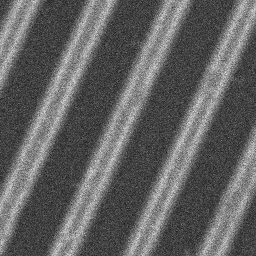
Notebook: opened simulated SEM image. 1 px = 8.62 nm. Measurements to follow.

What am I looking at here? one or a few lines or trenches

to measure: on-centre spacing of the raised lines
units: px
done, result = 68.1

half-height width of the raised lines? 180 nm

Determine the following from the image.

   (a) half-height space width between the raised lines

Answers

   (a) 47.1 pixels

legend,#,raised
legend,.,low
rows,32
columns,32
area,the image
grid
..###......###.......##.......##
.###.......###......###.......##
.###......###.......##.......###
###.......###......###.......##.
###......###.......##.......###.
##.......###......###.......##..
##......###.......###......###..
#.......###......###.......##...
#......###.......###......###...
#......###......###.......###...
.......##.......###......###....
......###.......##.......###....
......###......###.......##.....
.....###.......###......###.....
.....###......###.......##......
....###.......##.......###......
....###......###.......##.......
...###.......###......###.......
...###......###.......###......#
..####......###......###.......#
..###.......##.......###......##
..###......###......###.......##
.###.......##.......###......###
.###......###.......##.......###
###.......##.......###......###.
###......###.......##.......###.
##.......###......###......###..
##......###.......##.......###..
#.......###......###.......##...
#......###.......###......###...
.......###......###.......##....
.......##.......###......###....